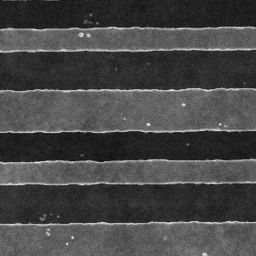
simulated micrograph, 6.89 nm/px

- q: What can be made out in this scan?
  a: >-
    lines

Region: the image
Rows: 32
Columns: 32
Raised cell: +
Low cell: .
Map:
................................
................................
................................
.............++.++.........+++++
++++++++++++++++++++++++++++++++
++++++++++++++++++++++++++++++++
................................
................................
................................
................................
................................
++++++++++++++++++++++++++++++++
++++++++++++++++++++++++++++++++
++++++++++++++++++++++++++++++++
++++++++++++++++++++++++++++++++
++++++++++++++++++++++++++++++++
++++++++...++......+............
................................
................................
................................
++++++++++++++++++++++++++++++++
++++++++++++++++++++++++++++++++
++++++++++++++++++++++++++++++++
................................
................................
................................
................................
................................
++++++++++++++++++++++++++++++++
++++++++++++++++++++++++++++++++
++++++++++++++++++++++++++++++++
++++++++++++++++++++++++++++++++